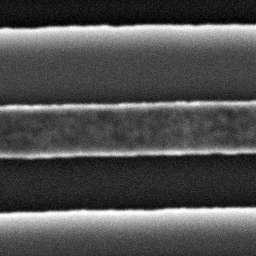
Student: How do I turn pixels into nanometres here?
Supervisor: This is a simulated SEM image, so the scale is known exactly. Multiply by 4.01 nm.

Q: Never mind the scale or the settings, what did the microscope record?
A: lines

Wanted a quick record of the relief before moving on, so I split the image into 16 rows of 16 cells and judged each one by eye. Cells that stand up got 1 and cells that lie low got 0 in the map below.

0000000000000000
0000000000000000
1111111111111111
1111111111111111
1111111111111111
1111111111111111
1111111111111111
1111111111111111
1111111111111111
1111111111111111
0000000000000000
0000000000000000
0000000000000000
1111111111111111
1111111111111111
1111111111111111